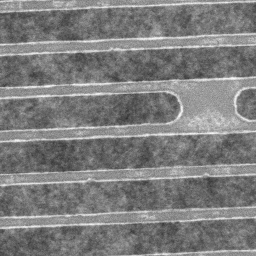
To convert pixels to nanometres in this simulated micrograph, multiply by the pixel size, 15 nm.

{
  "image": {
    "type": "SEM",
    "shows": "parallel lines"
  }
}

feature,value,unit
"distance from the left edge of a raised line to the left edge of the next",650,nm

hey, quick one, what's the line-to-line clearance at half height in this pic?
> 158 nm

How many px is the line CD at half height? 32.5